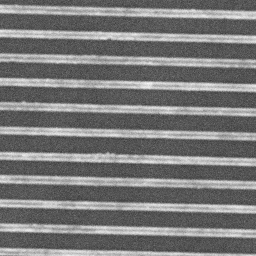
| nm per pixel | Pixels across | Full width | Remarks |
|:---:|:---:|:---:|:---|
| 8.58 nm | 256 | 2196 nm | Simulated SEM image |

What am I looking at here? parallel lines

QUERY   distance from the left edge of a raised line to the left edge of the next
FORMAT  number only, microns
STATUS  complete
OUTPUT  0.208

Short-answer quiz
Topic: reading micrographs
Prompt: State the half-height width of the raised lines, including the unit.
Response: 0.0504 micrometres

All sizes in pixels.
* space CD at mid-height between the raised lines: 18.8